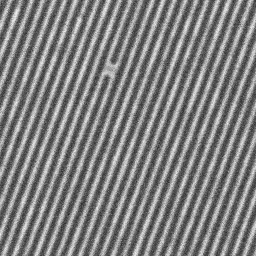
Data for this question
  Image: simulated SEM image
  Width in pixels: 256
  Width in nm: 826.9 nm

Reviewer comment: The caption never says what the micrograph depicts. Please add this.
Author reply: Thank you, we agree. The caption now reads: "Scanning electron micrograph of parallel lines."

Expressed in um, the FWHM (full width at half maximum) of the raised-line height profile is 0.0083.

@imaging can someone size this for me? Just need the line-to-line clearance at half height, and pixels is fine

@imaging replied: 7.99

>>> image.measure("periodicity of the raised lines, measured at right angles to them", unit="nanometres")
33.2